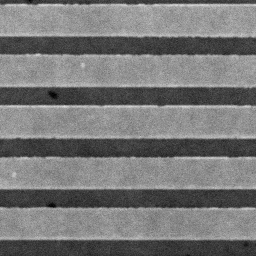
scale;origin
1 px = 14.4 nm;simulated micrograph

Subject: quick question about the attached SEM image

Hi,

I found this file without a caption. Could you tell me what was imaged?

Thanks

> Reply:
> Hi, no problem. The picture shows lines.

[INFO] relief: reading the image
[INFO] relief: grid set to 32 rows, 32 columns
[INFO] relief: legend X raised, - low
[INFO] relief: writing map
--------------------------------
XXXXXXXXXXXXXXXXXXXXXXXXXXXXXXXX
XXXXXXXXXXXXXXXXXXXXXXXXXXXXXXXX
XXXXXXXXXXXXXXXXXXXXXXXXXXXXXXXX
--------------------------------
--------------------------------
--------------------------------
XXXXXXXXXXXXXXXXXXXXXXXXXXXXXXXX
XXXXXXXXXXXXXXXXXXXXXXXXXXXXXXXX
XXXXXXXXXXXXXXXXXXXXXXXXXXXXXXXX
XXXXXXXXXXXXXXXXXXXXXXXXXXXXXXXX
--------------------------------
--------------------------------
XXXXXXXXXXXXXXXXXXXXXXXXXXXXXXXX
XXXXXXXXXXXXXXXXXXXXXXXXXXXXXXXX
XXXXXXXXXXXXXXXXXXXXXXXXXXXXXXXX
XXXXXXXXXXXXXXXXXXXXXXXXXXXXXXXX
--------------------------------
--------------------------------
--------------------------------
XXXXXXXXXXXXXXXXXXXXXXXXXXXXXXXX
XXXXXXXXXXXXXXXXXXXXXXXXXXXXXXXX
XXXXXXXXXXXXXXXXXXXXXXXXXXXXXXXX
------------X-XXX----XXX-XXXXXXX
--------------------------------
--------------------------------
XXXXXXXXXXXXXXXXXXXXXXXXXXXXXXXX
XXXXXXXXXXXXXXXXXXXXXXXXXXXXXXXX
XXXXXXXXXXXXXXXXXXXXXXXXXXXXXXXX
XXXXXXXXXXXXXXXXXXXXXXXXXXXXXXXX
--------------------------------
--------------------------------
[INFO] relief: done